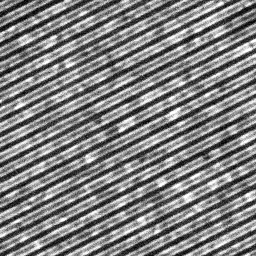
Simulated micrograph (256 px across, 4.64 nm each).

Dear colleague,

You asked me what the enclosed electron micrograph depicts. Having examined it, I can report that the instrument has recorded parallel lines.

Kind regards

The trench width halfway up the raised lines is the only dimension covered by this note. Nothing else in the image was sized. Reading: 29.5 nm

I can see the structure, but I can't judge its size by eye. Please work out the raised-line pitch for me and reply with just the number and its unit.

62.3 nm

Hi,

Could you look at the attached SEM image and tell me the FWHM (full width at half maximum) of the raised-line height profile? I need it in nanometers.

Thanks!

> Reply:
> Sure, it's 30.